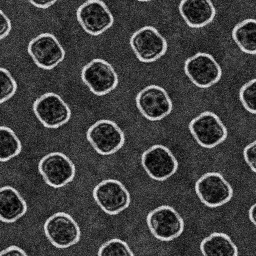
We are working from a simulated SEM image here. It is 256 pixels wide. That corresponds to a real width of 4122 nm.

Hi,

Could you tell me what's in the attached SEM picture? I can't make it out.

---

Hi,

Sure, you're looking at a regular array of raised bodies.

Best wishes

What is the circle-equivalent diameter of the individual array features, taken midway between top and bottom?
519 nm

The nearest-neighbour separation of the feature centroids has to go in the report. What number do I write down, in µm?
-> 0.941